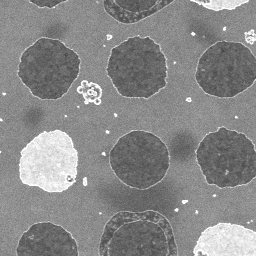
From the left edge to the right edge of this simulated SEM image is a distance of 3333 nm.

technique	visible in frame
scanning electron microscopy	raised bodies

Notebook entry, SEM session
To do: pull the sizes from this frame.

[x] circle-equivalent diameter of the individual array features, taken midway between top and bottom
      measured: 779 nm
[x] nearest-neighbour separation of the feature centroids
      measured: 1170 nm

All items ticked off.